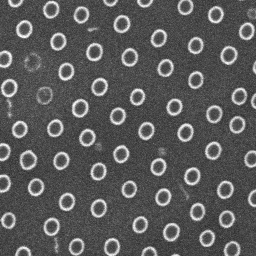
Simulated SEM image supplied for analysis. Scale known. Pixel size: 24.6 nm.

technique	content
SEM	a regular array of raised bodies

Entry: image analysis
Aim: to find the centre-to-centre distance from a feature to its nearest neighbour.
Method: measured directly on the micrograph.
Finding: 756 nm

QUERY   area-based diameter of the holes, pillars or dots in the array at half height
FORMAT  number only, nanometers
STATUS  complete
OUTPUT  368